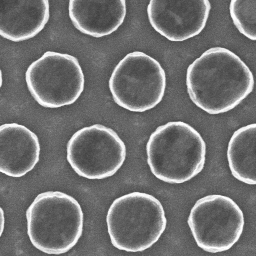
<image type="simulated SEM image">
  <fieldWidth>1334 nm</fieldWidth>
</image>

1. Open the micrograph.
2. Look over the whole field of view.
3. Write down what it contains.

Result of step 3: a regular array of raised bodies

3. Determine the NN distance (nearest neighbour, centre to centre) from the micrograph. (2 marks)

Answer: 0.419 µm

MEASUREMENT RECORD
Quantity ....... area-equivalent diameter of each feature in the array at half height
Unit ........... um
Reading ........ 0.294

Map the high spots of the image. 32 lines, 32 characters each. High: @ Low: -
@@@@@@---@@@@@@@---@@@@@@@---@@@
@@@@@@---@@@@@@@---@@@@@@@---@@@
@@@@@@---@@@@@@----@@@@@@@---@@@
@@@@@-----@@@@-----@@@@@@-----@@
-@@@-----------------@@@-------@
--------------------------------
--------------------------@@@---
-----@@@@------@@@@------@@@@@--
----@@@@@@-----@@@@@----@@@@@@@-
---@@@@@@@----@@@@@@---@@@@@@@@-
----@@@@@@----@@@@@@----@@@@@@@-
----@@@@@@----@@@@@@----@@@@@@@-
-----@@@@------@@@@@----@@@@@@--
----------------@@@------@@@@---
--------------------------------
---------------------@@---------
@@@@------@@@@------@@@@------@@
@@@@@----@@@@@@----@@@@@@----@@@
@@@@@----@@@@@@----@@@@@@----@@@
@@@@@----@@@@@@----@@@@@@----@@@
@@@@-----@@@@@@----@@@@@@----@@@
@@@-------@@@@-----@@@@@@----@@@
---------------------@@-------@@
--------------------------------
-----@@@--------@@@--------@----
----@@@@@@----@@@@@@-----@@@@---
----@@@@@@----@@@@@@----@@@@@@--
----@@@@@@---@@@@@@@@---@@@@@@--
----@@@@@@----@@@@@@----@@@@@@--
----@@@@@@----@@@@@@----@@@@@@--
----@@@@@-----@@@@@------@@@@---
-------@------------------------